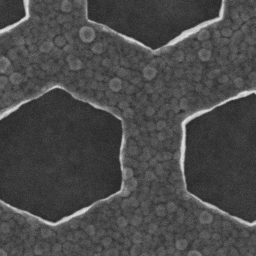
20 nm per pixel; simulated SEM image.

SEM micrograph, holes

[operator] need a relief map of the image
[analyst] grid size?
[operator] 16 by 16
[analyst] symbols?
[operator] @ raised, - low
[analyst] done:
--@@@---------@@
-@@@@@-------@@@
@@@@@@@@---@@@@@
@@@@@@@@@@@@@@@@
@@@@@@@@@@@@@@@@
@@@@@@@@@@@@@@@@
@-----@@@@@@@@--
-------@@@@@----
--------@@@@----
-------@@@@@----
--------@@@-----
--------@@@@----
------@@@@@@@---
@@--@@@@@@@@@@--
@@@@@@@@@@@@@@@@
@@@@@@@@@@@@@@@@